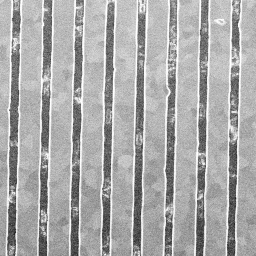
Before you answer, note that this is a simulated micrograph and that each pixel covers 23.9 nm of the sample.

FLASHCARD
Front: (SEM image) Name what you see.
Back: parallel lines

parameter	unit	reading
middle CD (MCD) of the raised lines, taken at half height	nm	523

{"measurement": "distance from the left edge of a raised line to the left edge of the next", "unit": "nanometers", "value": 751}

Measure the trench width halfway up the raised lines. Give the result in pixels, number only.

9.62